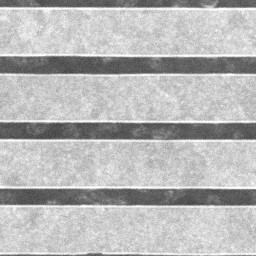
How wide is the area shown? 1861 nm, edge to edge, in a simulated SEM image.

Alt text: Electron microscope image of one or a few lines or trenches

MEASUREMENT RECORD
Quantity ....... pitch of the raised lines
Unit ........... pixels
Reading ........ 66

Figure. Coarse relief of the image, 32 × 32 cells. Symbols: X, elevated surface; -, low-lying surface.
--------------------------------
XXXXXXXXXXXXXXXXXXXXXXXXXXXXXXXX
XXXXXXXXXXXXXXXXXXXXXXXXXXXXXXXX
XXXXXXXXXXXXXXXXXXXXXXXXXXXXXXXX
XXXXXXXXXXXXXXXXXXXXXXXXXXXXXXXX
XXXXXXXXXXXXXXXXXXXXXXXXXXXXXXXX
XXXXXXXXXXXXXXXXXXXXXXXXXXXXXXXX
--------------------------------
--------------------------------
XXXXXXXXXXXXXXXXXXXXXXXXXXXXXXXX
XXXXXXXXXXXXXXXXXXXXXXXXXXXXXXXX
XXXXXXXXXXXXXXXXXXXXXXXXXXXXXXXX
XXXXXXXXXXXXXXXXXXXXXXXXXXXXXXXX
XXXXXXXXXXXXXXXXXXXXXXXXXXXXXXXX
XXXXXXXXXXXXXXXXXXXXXXXXXXXXXXXX
--------------------------------
--------------------------------
--------------------------------
XXXXXXXXXXXXXXXXXXXXXXXXXXXXXXXX
XXXXXXXXXXXXXXXXXXXXXXXXXXXXXXXX
XXXXXXXXXXXXXXXXXXXXXXXXXXXXXXXX
XXXXXXXXXXXXXXXXXXXXXXXXXXXXXXXX
XXXXXXXXXXXXXXXXXXXXXXXXXXXXXXXX
--------------------------------
--------------------------------
--------------------------------
XXXXXXXXXXXXXXXXXXXXXXXXXXXXXXXX
XXXXXXXXXXXXXXXXXXXXXXXXXXXXXXXX
XXXXXXXXXXXXXXXXXXXXXXXXXXXXXXXX
XXXXXXXXXXXXXXXXXXXXXXXXXXXXXXXX
XXXXXXXXXXXXXXXXXXXXXXXXXXXXXXXX
XXXXXXXXXXXXXXXXXXXXXXXXXXXXXXXX